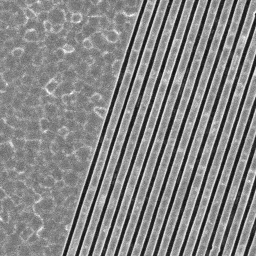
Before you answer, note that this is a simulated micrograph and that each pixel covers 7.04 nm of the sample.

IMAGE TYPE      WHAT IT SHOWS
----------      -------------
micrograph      parallel lines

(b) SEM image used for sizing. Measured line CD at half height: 52.9 nm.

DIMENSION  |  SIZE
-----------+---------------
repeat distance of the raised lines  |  86.7 nanometres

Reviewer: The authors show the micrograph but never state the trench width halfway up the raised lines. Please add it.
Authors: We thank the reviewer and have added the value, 32.7 nanometers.